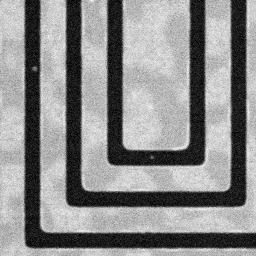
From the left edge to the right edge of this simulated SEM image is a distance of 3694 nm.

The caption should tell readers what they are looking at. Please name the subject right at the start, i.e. groups of lines, slits or small figures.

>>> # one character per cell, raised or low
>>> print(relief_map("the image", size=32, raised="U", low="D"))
UUUDDUUUDDUUUDDDUUUUUUUUDDUUUDDU
UUUDDUUUDDUUUDDDUUUUUUUUDDUUUDDU
UUUDDUUUDDUUUDDDUUUUUUUUDDUUUDDU
UUUDDUUUDDUUUDDDUUUUUUUUDDUUUDDU
UUUDDUUUDDUUUDDDUUUUUUUUDDUUUDDU
UUUDDUUUDDUUUDDDUUUUUUUUDDUUUDDU
UUUDDUUUDDUUUDDDUUUUUUUUDDUUUDDU
UUUDDUUUDDUUUDDDUUUUUUUDDDUUUDDU
UUUDDUUUDDUUUDDDUUUUUUUDDDUUUDDU
UUUDDUUUDDUUUDDDUUUUUUUDDDUUUDDU
UUUDDUUUDDUUUDDUUUUUUUUUDDUUUDDU
UUUDDUUUDDUUUDDUUUUUUUUUDDUUUDDU
UUUDDUUUDDUUUDDUUUUUUUUUDDUUUDDU
UUUDDUUUDDUUUDDUUUUUUUUUDDUUUDDU
UUUDDUUUDDUUUDDUUUUUUUUUDDUUUDDU
UUUDDUUUDDUUUDDDUUUUUUUUDDUUUDDU
UUUDDUUUDDUUUDDDUUUUUUUDDDUUUDDU
UUUDDUUUDDUUUDDDUUUUUUUDDDUUUDDU
UUUDDUUUDDUUUDDDUUUUUUUDDDUUUDDU
UUUDDUUUDDUUUDDDDDDDDDDDDDUUUDDU
UUUDDUUUDDUUUUDDDDDDDDDDDUUUUDDU
UUUDDUUUDDUUUUUUUUUUUUUUUUUUUDDU
UUUDDUUUDDUUUUUUUUUUUUUUUUUUUDDU
UUUDDUUUDDDUUUUUUUUUUUUUUUUUDDDU
UUUDDUUUDDDDDDDDDDDDDDDDDDDDDDDU
UUUDDUUUDDDDDDDDDDDDDDDDDDDDDDDU
UUUDDUUUUUUUUUUUUUUUUUUUUUUUUUUU
UUUDDUUUUUUUUUUUUUUUUUUUUUUUUUUU
UUUDDUUUUUUUUUUUUUUUUUUUUUUUUUUU
UUUDDDDDDDDDDDDDDDDDDDDDDDDDDDDD
UUUDDDDDDDDDDDDDDDDDDDDDDDDDDDDD
UUUUUUUUUUUUUUUUUUUUUUUUUUUUUUUU